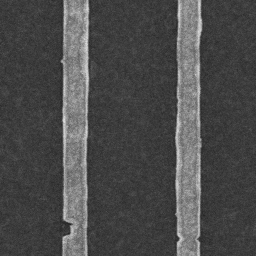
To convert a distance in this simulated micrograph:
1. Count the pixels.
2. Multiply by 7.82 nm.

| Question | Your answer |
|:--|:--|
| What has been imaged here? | one or a few lines or trenches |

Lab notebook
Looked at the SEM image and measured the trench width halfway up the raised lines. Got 716 nanometres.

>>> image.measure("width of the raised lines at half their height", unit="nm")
171